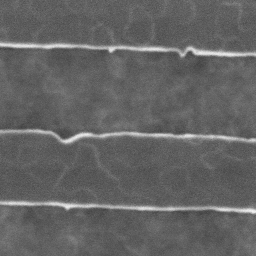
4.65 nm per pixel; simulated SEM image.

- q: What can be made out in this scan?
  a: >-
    one or a few lines or trenches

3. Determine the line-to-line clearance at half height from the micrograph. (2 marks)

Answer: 392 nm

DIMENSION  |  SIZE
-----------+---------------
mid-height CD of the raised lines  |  73.7 pixels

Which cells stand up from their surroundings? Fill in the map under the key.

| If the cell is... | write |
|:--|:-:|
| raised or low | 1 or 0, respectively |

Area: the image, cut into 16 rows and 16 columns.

1111111111111111
1111111111111111
1111111111111111
0000000000000000
0000000000000000
0000000000000000
0000000000000000
0000000000000000
1111011111111000
1111111111111111
1111111111111111
1111111111111111
1111111111111111
0000000000000000
0000000000000000
0000000000000000